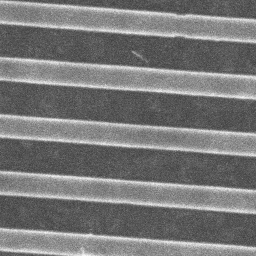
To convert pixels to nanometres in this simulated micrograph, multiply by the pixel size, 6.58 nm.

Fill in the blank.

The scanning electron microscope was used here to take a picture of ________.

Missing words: parallel lines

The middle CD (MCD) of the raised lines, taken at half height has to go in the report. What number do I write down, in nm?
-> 147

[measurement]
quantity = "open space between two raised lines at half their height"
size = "228 nm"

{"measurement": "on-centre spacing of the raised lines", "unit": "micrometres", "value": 0.373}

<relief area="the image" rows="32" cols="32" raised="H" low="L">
HHHHHLLLLLLLLLLLLLLLLLLLLLLLLLLL
HHHHHHHHHHHHHHHHHHLLLLLLLLLLLLLL
HHHHHHHHHHHHHHHHHHHHHHHHHHHHHHHL
LLLLLLLLHHHHHHHHHHHHHHHHHHHHHHHH
LLLLLLLLLLLLLLLLLLLLLLLHHHHHHHHH
LLLLLLLLLLLLLLLLLLLLLLLLLLLLLLLL
LLLLLLLLLLLLLLLLLLLLLLLLLLLLLLLL
HHHHLLLLLLLLLLLLLLLLLLLLLLLLLLLL
HHHHHHHHHHHHHHHHHLLLLLLLLLLLLLLL
HHHHHHHHHHHHHHHHHHHHHHHHHHHHHHLL
LLLLLLLHHHHHHHHHHHHHHHHHHHHHHHHH
LLLLLLLLLLLLLLLLLLLLHHHHHHHHHHHH
LLLLLLLLLLLLLLLLLLLLLLLLLLLLLLLL
LLLLLLLLLLLLLLLLLLLLLLLLLLLLLLLL
HLLLLLLLLLLLLLLLLLLLLLLLLLLLLLLL
HHHHHHHHHHHHHHLLLLLLLLLLLLLLLLLL
HHHHHHHHHHHHHHHHHHHHHHHHHHHHLLLL
LLLLLLHHHHHHHHHHHHHHHHHHHHHHHHHH
LLLLLLLLLLLLLLLLLLLHHHHHHHHHHHHH
LLLLLLLLLLLLLLLLLLLLLLLLLLLLLLLL
LLLLLLLLLLLLLLLLLLLLLLLLLLLLLLLL
LLLLLLLLLLLLLLLLLLLLLLLLLLLLLLLL
HHHHHHHHHHHHHHLLLLLLLLLLLLLLLLLL
HHHHHHHHHHHHHHHHHHHHHHHHHHHHLLLL
LLLLHHHHHHHHHHHHHHHHHHHHHHHHHHHH
LLLLLLLLLLLLLLLLLHHHHHHHHHHHHHHH
LLLLLLLLLLLLLLLLLLLLLLLLLLLLLLHH
LLLLLLLLLLLLLLLLLLLLLLLLLLLLLLLL
LLLLLLLLLLLLLLLLLLLLLLLLLLLLLLLL
HHHHHHHHHHHHLLLLLLLLLLLLLLLLLLLL
HHHHHHHHHHHHHHHHHHHHHHHHHHLLLLLL
LLLLHHHHHHHHHHHHHHHHHHHHHHHHHHHH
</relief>